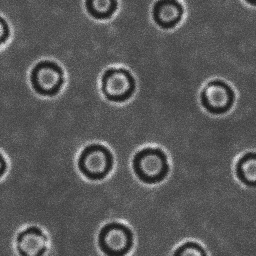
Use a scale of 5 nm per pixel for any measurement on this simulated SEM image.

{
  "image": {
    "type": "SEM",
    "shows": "ring-shaped grooves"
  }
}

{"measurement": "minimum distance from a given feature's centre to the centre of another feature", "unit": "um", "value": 0.362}